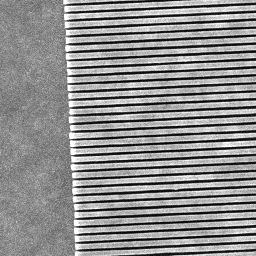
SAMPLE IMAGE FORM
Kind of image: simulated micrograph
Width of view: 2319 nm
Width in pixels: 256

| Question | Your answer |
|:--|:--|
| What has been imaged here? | parallel lines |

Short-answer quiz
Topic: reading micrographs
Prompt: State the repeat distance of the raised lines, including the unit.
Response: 71.9 nm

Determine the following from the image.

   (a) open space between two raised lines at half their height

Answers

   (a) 26 nm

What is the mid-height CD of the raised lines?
45.3 nanometers